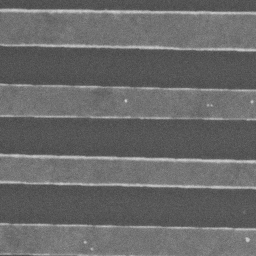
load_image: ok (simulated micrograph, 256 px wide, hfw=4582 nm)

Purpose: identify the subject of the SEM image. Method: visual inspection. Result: lines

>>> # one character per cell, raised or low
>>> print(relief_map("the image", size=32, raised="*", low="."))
................................
**************************......
********************************
********************************
********************************
********************************
................................
................................
................................
................................
................................
********************************
********************************
********************************
********************************
................................
................................
................................
................................
******..........................
********************************
********************************
********************************
..........................******
................................
................................
................................
................................
*************************.......
********************************
********************************
********************************